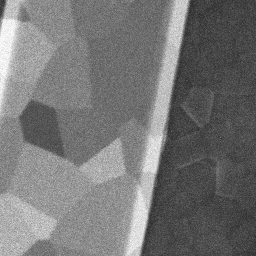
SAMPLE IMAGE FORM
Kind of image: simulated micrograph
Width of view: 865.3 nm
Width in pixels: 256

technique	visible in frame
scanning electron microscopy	one or a few lines or trenches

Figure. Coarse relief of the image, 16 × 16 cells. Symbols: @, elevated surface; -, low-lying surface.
-@@@@@@@@@@-----
-@@@@@@@@@@-----
@@@@@@@@@@@-----
@@@@@@@@@@@-----
@@@@@@@@@@@-----
@@@@@@@@@@------
@@@@@@@@@@------
@@@@@@@@@@------
@@@@@@@@@@------
@@@@@@@@@@------
@@@@@@@@@-------
@@@@@@@@@-------
@@@@@@@@@-------
@@@@@@@@@-------
@@@@@@@@@-------
@@@@@@@@--------